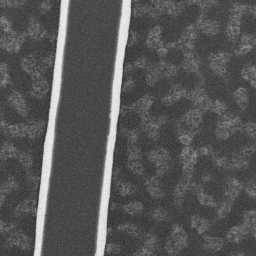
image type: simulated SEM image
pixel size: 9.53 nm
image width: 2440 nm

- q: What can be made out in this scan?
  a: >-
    one or a few lines or trenches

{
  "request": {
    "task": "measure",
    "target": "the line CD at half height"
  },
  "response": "602 nm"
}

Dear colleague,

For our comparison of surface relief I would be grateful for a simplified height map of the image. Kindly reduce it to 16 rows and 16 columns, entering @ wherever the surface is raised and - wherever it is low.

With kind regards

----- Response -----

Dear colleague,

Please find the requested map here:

----@@@@--------
----@@@@--------
----@@@@--------
----@@@@--------
----@@@---------
---@@@@---------
---@@@@---------
---@@@@---------
---@@@@---------
---@@@@---------
---@@@@---------
---@@@@---------
---@@@@---------
--@@@@----------
--@@@@----------
--@@@@----------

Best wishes